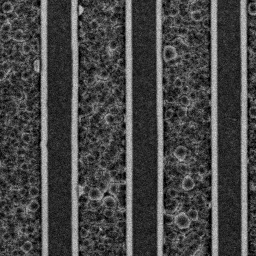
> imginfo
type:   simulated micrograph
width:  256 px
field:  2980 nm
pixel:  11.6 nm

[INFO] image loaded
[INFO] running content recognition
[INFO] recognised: one or a few lines or trenches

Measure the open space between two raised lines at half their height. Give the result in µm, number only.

0.642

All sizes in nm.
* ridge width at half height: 348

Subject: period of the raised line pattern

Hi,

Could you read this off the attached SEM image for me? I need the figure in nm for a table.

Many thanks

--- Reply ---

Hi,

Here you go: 988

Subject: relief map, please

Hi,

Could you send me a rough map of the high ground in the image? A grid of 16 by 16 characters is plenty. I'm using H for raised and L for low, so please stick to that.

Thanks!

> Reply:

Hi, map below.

LLLHHLLLHHLLLHHL
LLLHHLLLHHLLLHHL
LLLHHLLLHHLLLHHL
LLLHHLLLHHLLLHHL
LLLHHLLLHHLLLHHL
LLLHHLLLHHLLLHHL
LLLHHLLLHHLLLHHL
LLLHHLLLHHLLLHHL
LLLHHLLLHHLLLHHL
LLLHHLLLHHLLLHHL
LLLHHLLLHHLLLHHL
LLLHHLLLHHLLLHHL
LLLHHLLLHHLLLHHL
LLLHHLLLHHLLLHHL
LLLHHLLLHHLLLHHL
LLLHHLLLHHLLLHHL